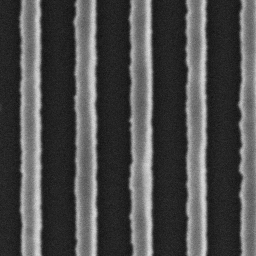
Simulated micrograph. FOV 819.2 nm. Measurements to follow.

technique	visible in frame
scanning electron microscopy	lines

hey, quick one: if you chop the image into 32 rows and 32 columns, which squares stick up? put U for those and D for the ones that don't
DDDUUDDDDDUUDDDDUUUDDDDUUUDDDDUU
DDDUUDDDDDUUDDDDUUUDDDDDUUDDDDUU
DDDUUDDDDUUUDDDDUUUDDDDUUUDDDDUU
DDDUUDDDDUUUDDDDUUUDDDDUUUDDDDUU
DDDUUDDDDUUUDDDDUUUDDDDUUUDDDDUU
DDDUUDDDDDUUDDDDUUUDDDDUUUDDDDUU
DDDUUDDDDDUUDDDDUUUDDDDUUUDDDDUU
DDDUUDDDDDUUDDDDUUUDDDDUUUDDDDUU
DDDUUDDDDUUUDDDDUUUDDDDDUUDDDDUU
DDDUUDDDDUUUDDDDUUUDDDDDUUDDDDUU
DDDUUDDDDDUUDDDDUUUDDDDUUUDDDDUU
DDDUUDDDDDUUDDDDUUUDDDDUUUDDDDUU
DDDUUDDDDUUUDDDDUUUDDDDUUUDDDDUU
DDDUUDDDDUUUDDDDUUUDDDDUUUDDDDUU
DDDUUDDDDDUUDDDDUUUDDDDUUUDDDDUU
DDDUUDDDDDUUDDDDUUUDDDDUUUDDDDUU
DDDUUDDDDDUUDDDDUUUDDDDUUUDDDDUU
DDDUUDDDDUUUDDDDUUUDDDDDUUDDDDUU
DDDUUDDDDDUUDDDDUUUDDDDDUUDDDDUU
DDDUUDDDDDUUDDDDUUUDDDDUUUDDDDUU
DDDUUDDDDUUUDDDDUUUDDDDUUUDDDDUU
DDDUUDDDDDUUDDDDUUUDDDDUUUDDDDUU
DDDUUDDDDUUUDDDDUUUDDDDDUUDDDDUU
DDDUUDDDDUUUDDDDUUUDDDDUUUDDDDUU
DDDUUDDDDUUUDDDDUUUDDDDDUUDDDDUU
DDDUUDDDDDUUDDDDUUUDDDDUUUDDDDUU
DDDUUDDDDDUUDDDDUUUDDDDUUUDDDDUU
DDDUUDDDDDUUDDDDUUUDDDDDUUDDDDUU
DDDUUDDDDDUUDDDDUUUDDDDDUUDDDDUU
DDDUUDDDDDUUDDDDUUUDDDDUUUDDDDUU
DDDUUDDDDDUUDDDDDUUDDDDUUUDDDDUU
DDDUUDDDDDUUDDDDDUUDDDDUUUDDDDUU